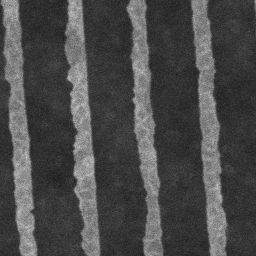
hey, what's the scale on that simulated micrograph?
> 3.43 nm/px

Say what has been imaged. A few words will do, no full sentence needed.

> one or a few lines or trenches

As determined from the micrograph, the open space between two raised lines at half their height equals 0.165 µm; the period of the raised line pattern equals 0.217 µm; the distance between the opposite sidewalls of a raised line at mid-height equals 0.0522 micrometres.